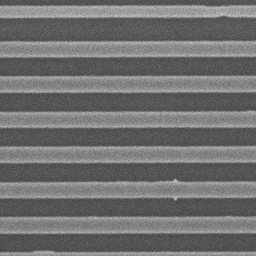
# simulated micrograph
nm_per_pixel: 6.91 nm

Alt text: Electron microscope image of parallel lines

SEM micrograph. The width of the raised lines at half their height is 107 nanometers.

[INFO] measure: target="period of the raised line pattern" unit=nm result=246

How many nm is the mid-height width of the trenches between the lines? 133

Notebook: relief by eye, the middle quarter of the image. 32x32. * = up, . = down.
................................
................................
................................
********************************
********************************
********************************
********************************
................................
................................
................................
................................
................................
********************************
********************************
********************************
********************************
................................
................................
................................
................................
................................
********************************
********************************
********************************
**.****......**.....**..........
................................
................................
................................
................................
........*....***..***..******...
********************************
********************************